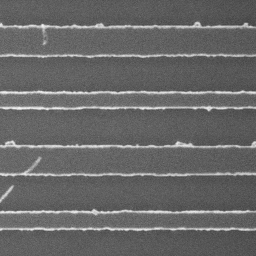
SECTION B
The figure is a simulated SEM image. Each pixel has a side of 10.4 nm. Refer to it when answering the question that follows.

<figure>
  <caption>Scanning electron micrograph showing lines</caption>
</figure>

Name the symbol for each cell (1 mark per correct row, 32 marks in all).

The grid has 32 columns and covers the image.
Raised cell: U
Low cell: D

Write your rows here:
DDDDDDDDDDDDDDDDDDDDDDDDDDDDDDDD
DDDDDDDDDDDDDDDDDDDDDDDDDDDDDDDD
DDDDDDDDDDDDDDDDDDDDDDDDDDDDDDDD
UUUUUUUUUUUUUUUUUUUUUUUUUUUUUUUU
UUUUUUUUUUUUUUUUUUUUUUUUUUUUUUUU
UUUUUUUUUUUUUUUUUUUUUUUUUUUUUUUU
UUUUUUUUUUUUUUUUUUUUUUUUUUUUUUUU
DDDDDDDDDDDDDDDDDDDDDDDDDDDDDDDD
DDDDDDDDDDDDDDDDDDDDDDDDDDDDDDDD
DDDDDDDDDDDDDDDDDDDDDDDDDDDDDDDD
DDDDDDDDDDDDDDDDDDDDDDDDDDDDDDDD
DDDDDDDDDDDDDDDDDDDDDDDDDDDDDDUD
UUUUUUUUUUUUUUUUUUUUUUUUUUUUUUUU
UUUDUUUUUUUDDUUUDUUUUDDDUUUUUUDD
DDDDDDDDDDDDDDDDDDDDDDDDDDDDDDDD
DDDDDDDDDDDDDDDDDDDDDDDDDDDDDDDD
DDDDDDDDDDDDDDDDDDDDDDDDDDDDDDDD
DDDDDDDDDDDDDDDDDDDDDDDDDDDDDDDD
UUUUUUUUUUUUUUUUUUUUUUUUUUUUUUUU
UUUUUUUUUUUUUUUUUUUUUUUUUUUUUUUU
UUUUUUUUUUUUUUUUUUUUUUUUUUUUUUUU
UUUUUUUUUUUUUUUUUUUUUUUUUUUUUUUU
DDDDDDDDDDDDDDDDDDDDDDDDDDDDDDDD
DDDDDDDDDDDDDDDDDDDDDDDDDDDDDDDD
DDDDDDDDDDDDDDDDDDDDDDDDDDDDDDDD
DDDDDDDDDDDDDDDDDDDDDDDDDDDDDDDD
DUUUUUUUUUUUUUUUUUUUUUUUUUUUUUUU
UUUUUUUUUUUUUUUUUUUUUUUUUUUUUUUU
UUUUUUUUUUUUUUUUUUUUUUUUUUUUUUUU
DDDDDDDDDDDDDDDDDDDDDDDDDDDDDDDD
DDDDDDDDDDDDDDDDDDDDDDDDDDDDDDDD
DDDDDDDDDDDDDDDDDDDDDDDDDDDDDDDD